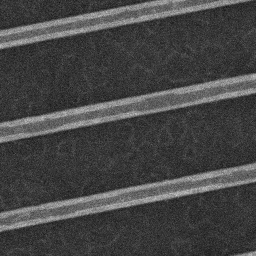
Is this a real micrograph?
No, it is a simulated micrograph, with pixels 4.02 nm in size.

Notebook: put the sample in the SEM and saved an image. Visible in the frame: one or a few lines or trenches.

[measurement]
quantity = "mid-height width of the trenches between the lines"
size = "0.291 micrometres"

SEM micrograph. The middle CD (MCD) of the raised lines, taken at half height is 59.6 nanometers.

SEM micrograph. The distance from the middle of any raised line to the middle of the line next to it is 357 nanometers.